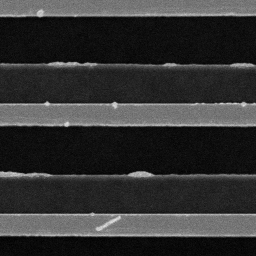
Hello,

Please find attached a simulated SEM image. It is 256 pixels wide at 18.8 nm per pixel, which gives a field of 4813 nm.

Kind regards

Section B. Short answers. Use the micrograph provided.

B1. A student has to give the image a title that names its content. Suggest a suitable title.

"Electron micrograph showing lines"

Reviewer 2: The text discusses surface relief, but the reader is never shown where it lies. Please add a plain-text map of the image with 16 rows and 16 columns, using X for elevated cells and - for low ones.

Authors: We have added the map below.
XXXXXXXXXXXXXXXX
----------------
----------------
----------------
XXXXXXXXXXXXXXXX
XXXXXXXXXXXXXXXX
XXXXXXXXXXXXXXXX
XXXXXXXXXXXXXXXX
----------------
----------------
----------------
XXXXXXXXXXXXXXXX
XXXXXXXXXXXXXXXX
XXXXXXXXXXXXXXXX
XXXXXXXXXXXXXXXX
----------------